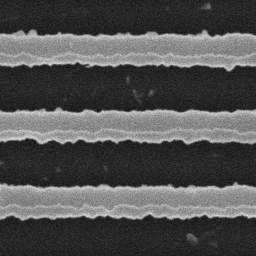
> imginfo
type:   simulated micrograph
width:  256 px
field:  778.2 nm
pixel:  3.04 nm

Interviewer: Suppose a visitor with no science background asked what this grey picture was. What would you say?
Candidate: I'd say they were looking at lines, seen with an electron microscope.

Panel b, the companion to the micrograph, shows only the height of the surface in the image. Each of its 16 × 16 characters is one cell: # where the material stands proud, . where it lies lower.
................
................
################
################
................
................
................
################
################
................
................
................
################
################
................
................